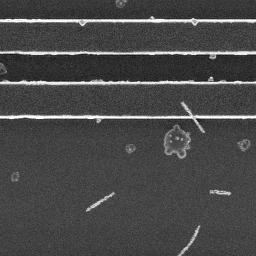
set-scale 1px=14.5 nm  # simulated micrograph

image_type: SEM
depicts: lines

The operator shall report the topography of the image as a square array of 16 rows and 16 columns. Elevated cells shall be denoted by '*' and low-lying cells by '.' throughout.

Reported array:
................
****************
****************
................
................
****************
****************
................
................
................
................
................
................
................
................
................